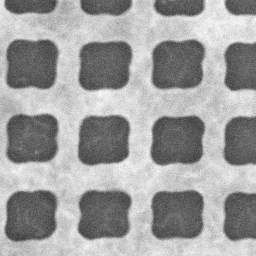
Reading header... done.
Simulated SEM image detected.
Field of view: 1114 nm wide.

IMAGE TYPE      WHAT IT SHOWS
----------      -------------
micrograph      a regular array of holes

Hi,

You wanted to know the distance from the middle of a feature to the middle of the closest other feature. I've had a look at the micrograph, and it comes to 318 nm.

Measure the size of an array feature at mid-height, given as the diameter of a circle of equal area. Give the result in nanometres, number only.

240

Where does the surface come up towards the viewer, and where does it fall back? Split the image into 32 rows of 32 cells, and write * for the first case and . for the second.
*......***.......**.......**....
*.....*****.....****.....****...
********************************
********************************
********************************
*......****.....****.....****...
*......***.......**.......**....
*......***......***......***....
*......***......***......***....
*......***......***......***....
*......***......***......***....
***********.********************
********************************
********************************
**.....****.*..***************.*
*......***......***......***....
*......***......***......***....
*......***......***......***....
*......***......***......***....
*......***......***......***....
**********....******.**.*****...
********************************
********************************
********************************
*......***......***......***....
*......***......***......***....
*......***......***......***....
*......***......***......***....
*......***......***......***....
*.....****......***......***....
********************************
********************************